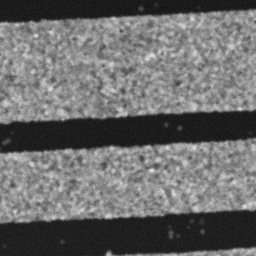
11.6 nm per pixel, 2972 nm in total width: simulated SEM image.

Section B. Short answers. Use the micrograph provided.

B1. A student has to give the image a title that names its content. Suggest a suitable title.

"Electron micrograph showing one or a few lines or trenches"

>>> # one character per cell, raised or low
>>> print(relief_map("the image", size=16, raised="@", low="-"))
----------------
@@@@@@@@@@@@@@@@
@@@@@@@@@@@@@@@@
@@@@@@@@@@@@@@@@
@@@@@@@@@@@@@@@@
@@@@@@@@@@@@@@@@
@@@@@@@@@@@@@@@@
@@--------------
----------------
---@@@@@@@@@@@@@
@@@@@@@@@@@@@@@@
@@@@@@@@@@@@@@@@
@@@@@@@@@@@@@@@@
@@@@@@@@--------
----------------
----------------